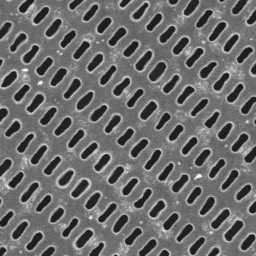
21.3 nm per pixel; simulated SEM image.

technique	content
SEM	a regular array of holes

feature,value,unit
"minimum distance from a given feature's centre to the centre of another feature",378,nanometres